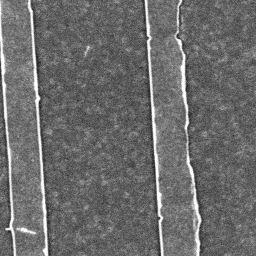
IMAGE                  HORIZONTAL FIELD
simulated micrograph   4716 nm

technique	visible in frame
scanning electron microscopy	one or a few lines or trenches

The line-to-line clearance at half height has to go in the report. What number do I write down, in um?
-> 2.1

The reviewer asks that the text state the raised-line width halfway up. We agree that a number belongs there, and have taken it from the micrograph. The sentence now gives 618 nm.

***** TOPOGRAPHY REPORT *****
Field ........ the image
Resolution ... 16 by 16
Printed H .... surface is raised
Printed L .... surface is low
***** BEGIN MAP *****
HHLLLLLLLHHLLLLL
HHLLLLLLLHHLLLLL
HHLLLLLLLHHLLLLL
HHLLLLLLLHHLLLLL
HHLLLLLLLHHLLLLL
HHLLLLLLLHHHLLLL
HHLLLLLLLLHHLLLL
HHLLLLLLLLHHLLLL
HHLLLLLLLLHHLLLL
LHHLLLLLLLHHLLLL
LHHLLLLLLLHHLLLL
LHHLLLLLLLHHLLLL
LHHLLLLLLLHHLLLL
LHHLLLLLLLHHLLLL
LHHLLLLLLLHHLLLL
LHHLLLLLLLHHLLLL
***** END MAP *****